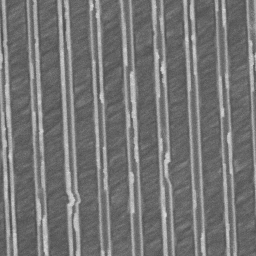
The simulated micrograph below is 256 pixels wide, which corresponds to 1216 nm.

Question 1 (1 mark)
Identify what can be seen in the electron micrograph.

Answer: parallel lines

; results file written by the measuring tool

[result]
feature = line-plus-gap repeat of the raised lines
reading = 149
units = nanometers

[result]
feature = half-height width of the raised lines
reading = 42.1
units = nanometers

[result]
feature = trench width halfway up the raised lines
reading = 106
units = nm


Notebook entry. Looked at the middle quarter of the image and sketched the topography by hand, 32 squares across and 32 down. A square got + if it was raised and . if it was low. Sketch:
++.....++......++......++......+
++.....++......++......++......+
++.....++......++......++......+
++.....++......++......++......+
++......++.....+++.....++......+
++......++.....+++.....++......+
++......++.....+++.....++......+
++......++......++.....++......+
++......++......++......++.....+
++......++......++......++.....+
++......++......++......++.....+
++......++......++......++.....+
++......++......++......++.....+
++......++......++......++......
++......++......++......++......
++......++......++......++......
++......++......++......++......
++......++......++......++......
++......++......++......++......
++......++......++......++......
+++.....++......++......++......
.++.....++......++......++......
.++.....++......++......++......
.++.....++......++......++......
.++.....++......++......++......
.++......++......++.....++......
.++......++.....+++.....++......
.++......++.....+++.....++......
.++......++......++.....++......
.++......++......++.....++......
.++......++......++......++.....
.++......++......++......++.....